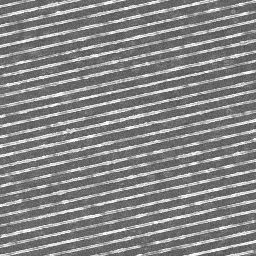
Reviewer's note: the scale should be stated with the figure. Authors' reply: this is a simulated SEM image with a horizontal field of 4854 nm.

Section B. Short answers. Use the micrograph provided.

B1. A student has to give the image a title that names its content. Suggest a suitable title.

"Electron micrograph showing parallel lines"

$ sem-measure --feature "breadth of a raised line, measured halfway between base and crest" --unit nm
41.7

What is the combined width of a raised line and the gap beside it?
9.77 px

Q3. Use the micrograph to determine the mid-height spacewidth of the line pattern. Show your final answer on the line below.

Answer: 139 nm